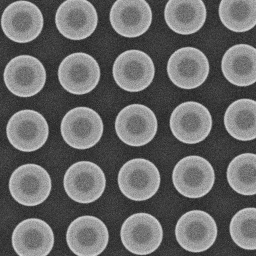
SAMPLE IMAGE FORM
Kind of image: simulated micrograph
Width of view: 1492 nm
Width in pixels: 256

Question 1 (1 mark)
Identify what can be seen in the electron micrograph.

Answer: an array of small figures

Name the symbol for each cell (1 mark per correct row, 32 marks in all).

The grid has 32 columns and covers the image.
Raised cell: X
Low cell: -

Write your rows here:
-XXX----XXX---XXXX---XXXX---XXXX
XXXXX--XXXXX--XXXXX--XXXXX-XXXXX
XXXXX--XXXXX--XXXXX--XXXXX--XXXX
XXXXX--XXXXX--XXXX---XXXX----XX-
-XXXX---XXX-----X---------------
--------------------------------
----------------XX----XXX---XXXX
-XXXX---XXXX--XXXXX--XXXXX--XXXX
-XXXX--XXXXX--XXXXX--XXXXX--XXXX
-XXXXX-XXXXX--XXXXX--XXXXX--XXXX
-XXXXX--XXXX---XXXX---XXX----XX-
-XXXX----XX---------------------
------------------------------X-
----------X-----XX----XXXX---XXX
--XXX---XXXX---XXXX--XXXXX--XXXX
-XXXXX--XXXXX-XXXXXX-XXXXX--XXXX
-XXXXX--XXXXX--XXXX---XXXX---XXX
-XXXXX--XXXX---XXXX---XXX-----X-
--XXX----XX---------------------
------------------------------XX
---------XXX----XXX---XXXX---XXX
--XXXX--XXXXX--XXXXX--XXXXX-XXXX
-XXXXX--XXXXX--XXXXX--XXXXX-XXXX
-XXXXX--XXXXX--XXXXX--XXXX---XXX
--XXXX---XXX----XXX----XX-------
---XX---------------------------
------------------------XX----XX
---XX----XXX----XXXX--XXXXX--XXX
--XXXX---XXXX--XXXXX--XXXXX--XXX
--XXXXX-XXXXXX-XXXXX--XXXXX--XXX
--XXXXX--XXXX--XXXXX--XXXXX---XX
--XXXX---XXXX---XXX-------------